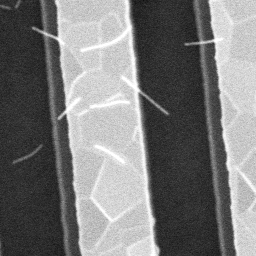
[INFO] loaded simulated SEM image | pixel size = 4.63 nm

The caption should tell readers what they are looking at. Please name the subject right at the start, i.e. lines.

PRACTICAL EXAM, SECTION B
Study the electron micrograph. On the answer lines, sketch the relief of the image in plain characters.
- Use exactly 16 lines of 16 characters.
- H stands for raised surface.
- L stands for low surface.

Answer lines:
LLLLHHHHLLLLLHHH
LLLLHHHHLLLLLHHH
LLLLHHHHLLLLLHHH
LLLLHHHHLLLLLHHH
LLLLHHHHLLLLLLHH
LLLLHHHHHLLLLLHH
LLLLHHHHHLLLLLHH
LLLLHHHHHLLLLLHH
LLLLHHHHHLLLLLHH
LLLLHHHHHLLLLLHH
LLLLLHHHHLLLLLHH
LLLLLHHHHLLLLLHH
LLLLLHHHHLLLLLHH
LLLLLHHHHLLLLLHH
LLLLLHHHHHLLLLLH
LLLLLHHHHHLLLLLH